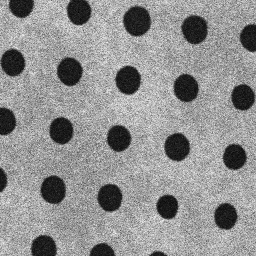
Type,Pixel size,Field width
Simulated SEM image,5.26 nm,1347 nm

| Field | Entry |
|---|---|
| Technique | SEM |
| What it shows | a regular array of holes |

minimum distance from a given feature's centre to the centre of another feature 305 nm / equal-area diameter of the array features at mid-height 136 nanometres